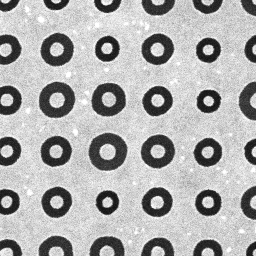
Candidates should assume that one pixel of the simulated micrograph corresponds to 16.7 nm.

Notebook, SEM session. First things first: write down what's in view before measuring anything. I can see a regular array of ring-shaped grooves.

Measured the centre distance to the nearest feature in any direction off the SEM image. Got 0.837 micrometres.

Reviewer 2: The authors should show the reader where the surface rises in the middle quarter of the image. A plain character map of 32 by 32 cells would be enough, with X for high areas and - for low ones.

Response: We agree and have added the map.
XXXXXXXXXXXXXXXXXXXXXXXXXXXXXXXX
XXXXXXXXXXXXXXXXXXXXXXXXXXXXXXXX
XXXXXXXXXXXXXXXXXXXXXXXXXXXXXXXX
XXXXXXXXXXXXXXXXXXXXXXXXXXXXXXXX
XXXXXXXXXXXXXXXXXXXXXXXXXXXXXXXX
--XXXXXX------XXXXXXXXX--XXXXXXX
--XXXXXX-------XXXXXX-----XXXXXX
---XXXX---XX---XXXXX-------XXXXX
---XXXX---XXX---XXXX--XXX--XXXXX
---XXXX---XXX---XXX---XXX--XXXXX
---XXXX--------XXXXX---X---XXXXX
--XXXXX--------XXXXX------XXXXXX
-XXXXXXX-----XXXXXXXX----XXXXXXX
XXXXXXXXXXXXXXXXXXXXXXXXXXXXXXXX
XXXXXXXXXXXXXXXXXXXXXXXXXXXXXXXX
XXXXXXXXXXXXXXXXXXXXXXXXXXXXXXXX
XXXXXXXXXXXXXXXXXXXXXXXXXXXXXXXX
XXXXXXXXX----XXXXXXXXXX-XXXXXXXX
XXXXXXX--------XXXXXX-----XXXXXX
-XXXXXX--------XXXXX-------XXXXX
--XXXX----XX----XXX----X----XXXX
--XXXX---XXXX---XXX---XXX---XXXX
--XXXX---XXXX---XXX---XXX---XXXX
--XXXX----XX----XXX---------XXXX
-XXXXXX--------XXXXX-------XXXXX
XXXXXXX-------XXXXXXX-----XXXXXX
XXXXXXXXX---XXXXXXXXXXXXXXXXXXXX
XXXXXXXXXXXXXXXXXXXXXXXXXXXXXXXX
XXXXXXXXXXXXXXXXXXXXXXXXXXXXXXXX
XXXXXXXXXXXXXXXXXXXXXXXXXXXXXXXX
XXXXXXXXXXXXXXXXXXXXXXXXXXXXXXXX
-XXXXXXXXX--XXXXXXXXX-----XXXXXX